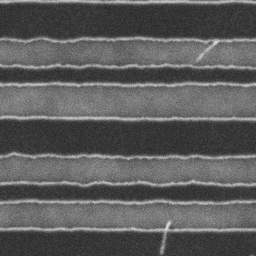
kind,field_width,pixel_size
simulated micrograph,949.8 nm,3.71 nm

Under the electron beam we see lines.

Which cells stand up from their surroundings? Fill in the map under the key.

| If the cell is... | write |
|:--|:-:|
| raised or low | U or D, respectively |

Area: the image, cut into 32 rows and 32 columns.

UUUUUUUUUUUUUUUUUUUUUUUUUUUUUUUU
UUUUUUUUUUUUUUUUUUUUUUUUUUUUUUUU
UUUUUUUUUUUUUUUUUUUUUUUUUUUUUUUU
UUUUUUUUUUUUUUUUUUUUUUUUUUUUUUUU
UUUUUUUUUUUUUUUUUUUUUUUUUUUUUUUU
DDDDDDDDDDDDDDDDDDDDDDDDDDDDDDDD
DDDDDDDDDDDDDDDDDDDDDDDDDDDDDDDD
DDDDDDDDDDDDDDDDDDDDDDDDDDDDDDDD
UUUUUUUUUUUUUUUUUUUUUUUUUUUUUUUU
UUUUUUUUUUUUUUUUUUUUUUUUUUUUUUUU
UUUUUUUUUUUUUUUUUUUUUUUUUUUUUUUU
DDDDDDDDDDDDDDDDDDDDDDDDDDDDDDDD
DDDDDDDDDDDDDDDDDDDDDDDDDDDDDDDD
DDDDDDDDDDDDDDDDDDDDDDDDDDDDDDDD
DDDDDDDDDDDDDDDDDDDDDDDDDDDDDDDD
UUUUUUUUUUUUUUUUUUUUUUUUUUUUUUUU
UUUUUUUUUUUUUUUUUUUUUUUUUUUUUUUU
UUUUUUUUUUUUUUUUUUUUUUUUUUUUUUUU
UUUUUUUUUUUUUUUUUUUUUUUUUUUUUUUU
UDDUUUUUUUUUUUUUUUUUUUUUUUUUUUUU
DDDDDDDDDDDDDDDDDDDDDDDDDDDDDDDD
DDDDDDDDDDDDDDDDDDDDDDDDDDDDDDDD
DDDDDDDDDDDDDDDDDDDDDDDDDDDDDDDD
UUUUUUUUUUUUUUUUUUUUUUUUUUUUUUUU
UUUUUUUUUUUUUUUUUUUUUUUUUUUUUUUU
DDDDDDDDDDDDDDDDDDDDDDDDDDDDDDDD
DDDDDDDDDDDDDDDDDDDDDDDDDDDDDDDD
DDDDDDDDDDDDDDDDDDDDDDDDDDDDDDDD
DDDDDDDDDDDDDDDDDDDDDDDDDDDDDDDD
UUUUUUUUUUUUUUUUUUUUUUUUUUUUUUUU
UUUUUUUUUUUUUUUUUUUUUUUUUUUUUUUU
UUUUUUUUUUUUUUUUUUUUUUUUUUUUUUUU